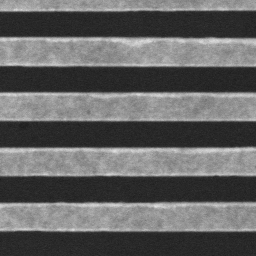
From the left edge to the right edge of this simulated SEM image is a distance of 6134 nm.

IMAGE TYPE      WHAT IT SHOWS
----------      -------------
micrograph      lines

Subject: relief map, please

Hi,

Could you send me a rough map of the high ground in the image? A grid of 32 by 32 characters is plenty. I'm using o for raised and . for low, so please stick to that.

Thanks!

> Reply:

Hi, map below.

oooooooooooooooooooooooooooooooo
................................
................................
................................
................................
oooooooooooooooooooooooooooooooo
oooooooooooooooooooooooooooooooo
oooooooooooooooooooooooooooooooo
................................
................................
................................
................................
oooooooooooooooooooooooooooooooo
oooooooooooooooooooooooooooooooo
oooooooooooooooooooooooooooooooo
................................
................................
................................
................................
oooooooooooooooooooooooooooooooo
oooooooooooooooooooooooooooooooo
oooooooooooooooooooooooooooooooo
................................
................................
................................
oooooooooooooooooooooooooooooooo
oooooooooooooooooooooooooooooooo
oooooooooooooooooooooooooooooooo
oooooooooooooooooooooooooooooooo
................................
................................
................................